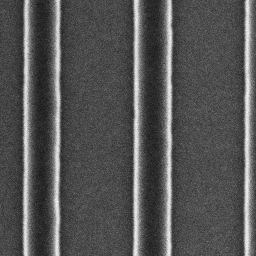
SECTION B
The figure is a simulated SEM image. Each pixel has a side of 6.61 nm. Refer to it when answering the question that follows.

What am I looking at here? one or a few lines or trenches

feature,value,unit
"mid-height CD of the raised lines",0.225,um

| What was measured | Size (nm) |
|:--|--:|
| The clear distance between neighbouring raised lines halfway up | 506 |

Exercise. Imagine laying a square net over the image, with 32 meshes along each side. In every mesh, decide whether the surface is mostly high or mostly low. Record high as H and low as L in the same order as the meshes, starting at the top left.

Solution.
LLLHHHHLLLLLLLLLLHHHHLLLLLLLLLLH
LLLHHHHLLLLLLLLLLHHHHLLLLLLLLLLH
LLLHHHHLLLLLLLLLLHHHHLLLLLLLLLLH
LLLHHHHLLLLLLLLLLHHHHLLLLLLLLLLH
LLLHHHHLLLLLLLLLLHHHHLLLLLLLLLLH
LLLHHHHLLLLLLLLLLHHHHLLLLLLLLLLH
LLLHHHHLLLLLLLLLLHHHHLLLLLLLLLLH
LLLHHHHLLLLLLLLLLHHHHLLLLLLLLLLH
LLLHHHHLLLLLLLLLLHHHHLLLLLLLLLLH
LLLHHHHLLLLLLLLLLHHHHLLLLLLLLLLH
LLLHHHHLLLLLLLLLLHHHHLLLLLLLLLLH
LLLHHHHLLLLLLLLLLHHHHLLLLLLLLLLH
LLLHHHHLLLLLLLLLLHHHHLLLLLLLLLLH
LLLHHHHLLLLLLLLLLHHHHLLLLLLLLLLH
LLLHHHHLLLLLLLLLLHHHHLLLLLLLLLLH
LLLHHHHLLLLLLLLLLHHHHLLLLLLLLLLH
LLLHHHHLLLLLLLLLLHHHHLLLLLLLLLLH
LLLHHHHLLLLLLLLLLHHHHLLLLLLLLLLH
LLLHHHHLLLLLLLLLLHHHHLLLLLLLLLLH
LLLHHHHLLLLLLLLLLHHHHLLLLLLLLLLH
LLLHHHHLLLLLLLLLLHHHHLLLLLLLLLLH
LLLHHHHLLLLLLLLLLHHHHLLLLLLLLLLH
LLLHHHHLLLLLLLLLLHHHHLLLLLLLLLLH
LLLHHHHLLLLLLLLLLHHHHLLLLLLLLLLH
LLLHHHHLLLLLLLLLLHHHHLLLLLLLLLLH
LLLHHHHLLLLLLLLLLHHHHLLLLLLLLLLH
LLLHHHHLLLLLLLLLLHHHHLLLLLLLLLLH
LLLHHHHLLLLLLLLLLHHHHLLLLLLLLLLH
LLLHHHHLLLLLLLLLLHHHHLLLLLLLLLLH
LLLHHHHLLLLLLLLLLHHHHLLLLLLLLLLH
LLLHHHHLLLLLLLLLLHHHHLLLLLLLLLLH
LLLHHHHLLLLLLLLLLHHHHLLLLLLLLLLH